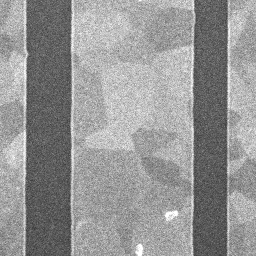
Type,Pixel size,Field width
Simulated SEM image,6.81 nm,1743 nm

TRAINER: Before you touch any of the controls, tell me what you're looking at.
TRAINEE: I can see one or a few lines or trenches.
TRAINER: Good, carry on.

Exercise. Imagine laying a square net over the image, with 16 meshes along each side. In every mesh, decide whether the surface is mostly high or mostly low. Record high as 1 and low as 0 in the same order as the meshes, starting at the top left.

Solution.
1100011111110011
1100011111110011
1100011111110011
1100011111110011
1100011111110011
1100011111110011
1100011111110011
1100111111110011
1100011111110011
1100011111110011
1100011111110011
1100011111110011
1100111111110011
1100011111110011
1100011111110011
1100011111110011